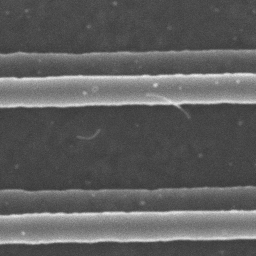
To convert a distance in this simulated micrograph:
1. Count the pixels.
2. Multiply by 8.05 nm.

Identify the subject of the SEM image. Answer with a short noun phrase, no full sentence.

lines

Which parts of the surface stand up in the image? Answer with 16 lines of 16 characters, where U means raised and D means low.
DDDDDDDDDDDDDDDD
DDDDDDDDDDDDDDDD
DDDDDDDDDDDDDDDD
UUUUUUUUUUUUUUUU
UUUUUUUUUUUUUUUU
UUUUUUUUUUUUUUUU
UUUUUUUUUUUUDDDD
DDDDDDDDDDDDDDDD
DDDDDDDDDDDDDDDD
DDDDDDDDDDDDDDDD
DDDDDDDDDDDDDDDD
DDDDDDDDDDDDDDDD
UUUUUUUUUUUUUUUU
UUUUUUUUUUUUUUUU
UUUUUUUUUUUUUUUU
DDDDDDDDDDDDDDDD